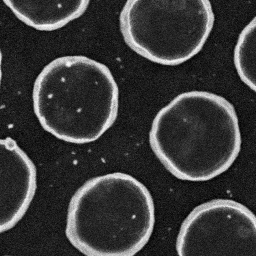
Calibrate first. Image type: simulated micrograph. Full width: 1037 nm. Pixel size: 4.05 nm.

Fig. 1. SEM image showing raised bodies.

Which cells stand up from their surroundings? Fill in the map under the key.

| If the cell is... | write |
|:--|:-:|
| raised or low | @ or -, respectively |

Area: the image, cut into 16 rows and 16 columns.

-@@@@---@@@@@---
--@@----@@@@@---
--------@@@@@--@
---------@@@---@
---@@@@--------@
--@@@@@---------
--@@@@@----@@@--
---@@@@---@@@@@-
----@@----@@@@@-
@---------@@@@@-
@@---------@@@--
@@----@@@-------
@@---@@@@-------
@---@@@@@@--@@@@
----@@@@@--@@@@@
-----@@@@--@@@@@